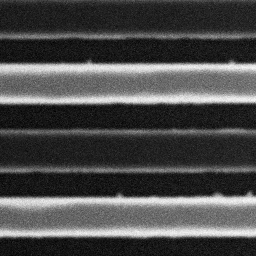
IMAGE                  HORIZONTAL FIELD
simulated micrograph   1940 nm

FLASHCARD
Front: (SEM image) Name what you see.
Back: lines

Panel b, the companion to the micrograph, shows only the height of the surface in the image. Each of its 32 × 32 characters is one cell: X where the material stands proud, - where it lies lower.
XXXXXXXXXXXXXXXXXXXXXXXXXXXXXXXX
XXXXXXXXXXXXXXXXXXXXXXXXXXXXXXXX
XXXXXXXXXXXXXXXXXXXXXXXXXXXXXXXX
XXXXXXXXXXXXXXXXXXXXXXXXXXXXXXXX
XXXXXXXXXXXXXXXXXXXXXXXXXXXXXXXX
--------------------------------
--------------------------------
--------------------------------
XXXXXXXXXXXXXXXXXXXXXXXXXXXXXXXX
XXXXXXXXXXXXXXXXXXXXXXXXXXXXXXXX
XXXXXXXXXXXXXXXXXXXXXXXXXXXXXXXX
XXXXXXXXXXXXXXXXXXXXXXXXXXXXXXXX
XXXXXXXXXXXXXXXXXXXXXXXXXXXXXXXX
--------------------------------
--------------------------------
--------------------------------
XXXXXXXXXXXXXXXXXXXXXXXXXXXXXXXX
XXXXXXXXXXXXXXXXXXXXXXXXXXXXXXXX
XXXXXXXXXXXXXXXXXXXXXXXXXXXXXXXX
XXXXXXXXXXXXXXXXXXXXXXXXXXXXXXXX
XXXXXXXXXXXXXXXXXXXXXXXXXXXXXXXX
--------------------------------
--------------------------------
--------------------------------
--------------------------------
XXXXXXXXXXXXXXXXXXXXXXXXXXXXXXXX
XXXXXXXXXXXXXXXXXXXXXXXXXXXXXXXX
XXXXXXXXXXXXXXXXXXXXXXXXXXXXXXXX
XXXXXXXXXXXXXXXXXXXXXXXXXXXXXXXX
XXXXXXXXXXXXX-------------------
--------------------------------
--------------------------------